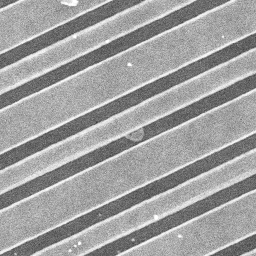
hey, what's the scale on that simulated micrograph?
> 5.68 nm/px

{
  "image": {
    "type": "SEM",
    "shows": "lines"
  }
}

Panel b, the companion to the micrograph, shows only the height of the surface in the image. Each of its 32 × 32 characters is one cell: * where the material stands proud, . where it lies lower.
.************....*******....****
***********....*******....******
*********....*******....********
*******....******.....**********
*****....******....************.
***....******....************...
*....******....************....*
...******....************....***
*******....************....*****
*****....************....******.
***....************....******...
.....***********....*******....*
..************....*******....***
************....*******....*****
**********....*******....*******
********....*******....*********
******....******.....***********
****....******.....***********..
**....******....************....
....******....************....**
..******....************....****
******....************....******
****....************....******..
**....***********.....******....
....***********....*******....**
..***********....*******....****
***********....*******....******
*********....*******....********
*******....******.....**********
*****....******.....***********.
***....******.....***********...
*....******....************....*